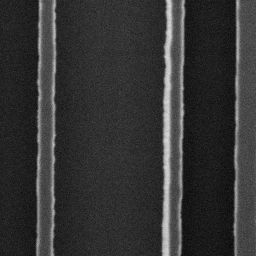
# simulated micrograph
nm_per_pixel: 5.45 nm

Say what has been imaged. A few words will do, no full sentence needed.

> lines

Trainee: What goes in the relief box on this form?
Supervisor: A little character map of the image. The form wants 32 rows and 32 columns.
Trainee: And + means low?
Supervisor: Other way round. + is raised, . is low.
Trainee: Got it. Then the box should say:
.....++..............++.......++
.....++..............++.......++
.....++..............++.......++
.....++..............++.......++
.....++..............++.......++
.....++..............++.......++
.....++..............++.......++
.....++..............++.......++
.....++..............++.......++
.....++..............++.......++
.....++..............++.......++
.....++..............++.......++
.....++..............++.......++
.....++..............++.......++
.....++..............++.......++
.....++..............++.......++
.....++..............++.......++
.....++..............++.......++
.....++..............++......+++
.....++..............++......+++
.....++..............++......+++
.....++..............++.......++
.....++..............++......+++
.....++..............++......+++
.....++..............++......+++
.....++..............++......+++
.....++..............++......+++
.....++..............++......+++
.....++..............++......+++
.....++..............++......+++
.....++..............++......+++
.....++..............++......+++